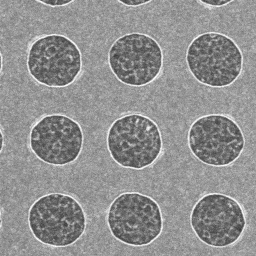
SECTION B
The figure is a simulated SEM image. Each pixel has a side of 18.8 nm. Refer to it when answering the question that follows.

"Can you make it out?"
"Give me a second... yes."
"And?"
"a regular array of raised bodies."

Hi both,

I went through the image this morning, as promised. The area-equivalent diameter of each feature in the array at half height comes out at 1.01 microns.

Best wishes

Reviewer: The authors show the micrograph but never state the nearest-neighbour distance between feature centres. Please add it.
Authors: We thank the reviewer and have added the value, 1480 nanometers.